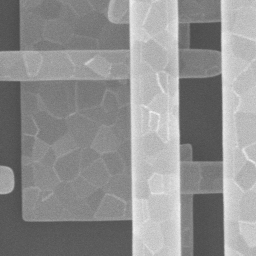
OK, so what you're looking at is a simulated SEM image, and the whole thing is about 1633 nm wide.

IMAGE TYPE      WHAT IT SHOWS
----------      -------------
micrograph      wiring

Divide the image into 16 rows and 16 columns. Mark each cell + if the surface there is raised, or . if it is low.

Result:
........+++...++
........+++...++
........+++...++
........+++...++
........+++...++
........+++...++
........+++...++
........+++...++
........+++...++
........+++...++
........+++...++
........+++...++
........+++...++
........+++...++
........+++...++
........+++...++